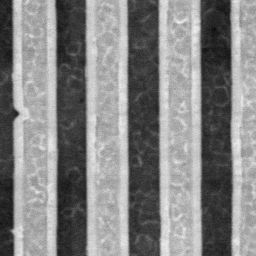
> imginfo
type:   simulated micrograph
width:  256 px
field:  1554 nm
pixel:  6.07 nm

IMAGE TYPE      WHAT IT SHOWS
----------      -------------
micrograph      one or a few lines or trenches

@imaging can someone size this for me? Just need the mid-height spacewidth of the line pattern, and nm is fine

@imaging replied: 239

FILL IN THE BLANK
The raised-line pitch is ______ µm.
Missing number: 0.44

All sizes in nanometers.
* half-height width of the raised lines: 200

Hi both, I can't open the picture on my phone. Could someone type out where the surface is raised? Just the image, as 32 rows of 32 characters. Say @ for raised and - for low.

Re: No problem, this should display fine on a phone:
--@@@@-----@@@@-----@@@@-----@@@
--@@@@-----@@@@-----@@@@@----@@@
--@@@@-----@@@@-----@@@@@----@@@
--@@@@@----@@@@-----@@@@@----@@@
--@@@@@----@@@@-----@@@@@----@@@
--@@@@@----@@@@-----@@@@@----@@@
--@@@@@----@@@@-----@@@@-----@@@
--@@@@@----@@@@-----@@@@-----@@@
--@@@@-----@@@@------@@@------@@
--@@@@------@@@------@@@------@@
--@@@@------@@@------@@@------@@
--@@@@-----@@@@------@@@------@@
--@@@@-----@@@@@-----@@@@-----@@
--@@@@------@@@------@@@@-----@@
---@@@-----@@@@------@@@@----@@@
--@@@@-----@@@@------@@@@----@@@
--@@@@-----@@@@------@@@@----@@@
--@@@@@----@@@@------@@@-----@@@
--@@@@@----@@@@------@@@-----@@@
--@@@@-----@@@@------@@@-----@@@
--@@@@-----@@@@------@@@-----@@@
--@@@@-----@@@@------@@@------@@
--@@@@@----@@@@------@@@------@@
--@@@@@----@@@@------@@@------@@
--@@@@@----@@@@------@@@------@@
--@@@@@----@@@@------@@@------@@
--@@@@------@@@------@@@------@@
--@@@@------@@@------@@@------@@
--@@@@@-----@@@------@@@@-----@@
--@@@@@-----@@@-----@@@@@----@@@
--@@@@@-----@@@-----@@@@@----@@@
--@@@@------@@@-----@@@@@----@@@